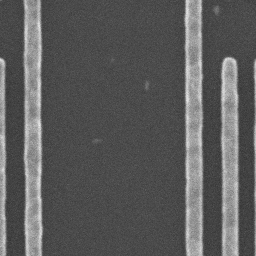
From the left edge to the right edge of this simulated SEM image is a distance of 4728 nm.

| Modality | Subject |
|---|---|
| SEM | wiring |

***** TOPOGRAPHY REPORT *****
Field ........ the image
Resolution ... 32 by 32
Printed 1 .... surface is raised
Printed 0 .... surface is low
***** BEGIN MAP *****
00011000000000000000000110000000
00011000000000000000000110000000
00011000000000000000000110000000
00011000000000000000000110000000
00011000000000000000000110000000
00011000000000000000000110000000
00011000000000000000000110000000
00011000000000000000000110001000
00011000000000000000000110001100
00011000000000000000000110001100
00011000000000000000000110001100
00011000000000000000000110001100
00011000000000000000000110001100
00011000000000000000000110001100
00011000000000000000000110001100
00011000000000000000000110001100
00011000000000000000000110001100
00011000000000000000000110001100
10011000000000000000000110001100
10011000000000000000000110001100
10011000000000000000000110001100
10011000000000000000000110001100
10011000000000000000000110001100
10011000000000000000000110001100
10011000000000000000000110001100
00011000000000000000000110001100
00011000000000000000000110001100
10011000000000000000000110001100
10011000000000000000000110001100
10011000000000000000000110001100
10011000000000000000000110001100
10011000000000000000000110001100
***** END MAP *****